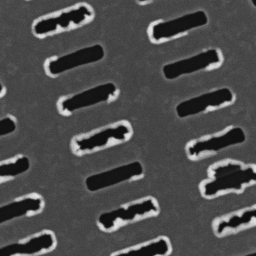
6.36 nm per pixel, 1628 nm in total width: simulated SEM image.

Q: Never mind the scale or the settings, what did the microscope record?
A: a regular array of holes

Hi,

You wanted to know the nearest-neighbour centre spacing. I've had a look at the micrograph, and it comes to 256 nm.